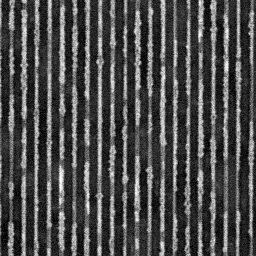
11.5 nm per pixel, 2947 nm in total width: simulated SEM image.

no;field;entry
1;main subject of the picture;parallel lines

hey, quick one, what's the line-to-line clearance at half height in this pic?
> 0.112 um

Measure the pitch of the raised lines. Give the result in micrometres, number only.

0.145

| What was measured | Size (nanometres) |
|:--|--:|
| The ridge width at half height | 30.2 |